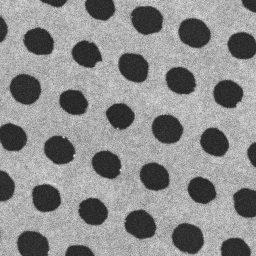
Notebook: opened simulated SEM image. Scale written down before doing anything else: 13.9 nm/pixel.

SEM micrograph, a regular array of holes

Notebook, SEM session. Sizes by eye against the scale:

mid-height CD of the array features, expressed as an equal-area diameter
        0.402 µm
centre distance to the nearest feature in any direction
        680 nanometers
